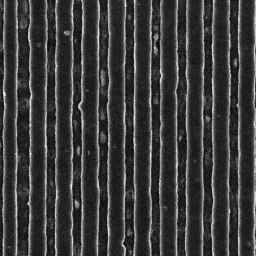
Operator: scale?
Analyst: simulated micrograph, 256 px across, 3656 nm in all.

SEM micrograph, parallel lines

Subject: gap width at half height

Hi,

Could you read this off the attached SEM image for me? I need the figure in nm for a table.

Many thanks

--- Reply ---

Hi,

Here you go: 132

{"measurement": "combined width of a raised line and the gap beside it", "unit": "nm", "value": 376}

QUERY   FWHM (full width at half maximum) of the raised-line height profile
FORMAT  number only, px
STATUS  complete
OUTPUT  16.9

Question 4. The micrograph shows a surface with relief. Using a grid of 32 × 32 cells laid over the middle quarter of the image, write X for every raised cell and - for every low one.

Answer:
XX---XXXX--XXXX---XXXX--XXXX---X
XX---XXXX--XXXX---XXXX--XXXX---X
XX---XXXX--XXXX---XXXX--XXXX---X
XX---XXXXX-XXXX---XXXX--XXXX---X
XX---XXXX---XXX---XXXX--XXXX---X
XX---XXXX--XXXX---XXXX--XXXX---X
XX---XXXX--XXXX---XXXX--XXXX---X
XX---XXXX--XXXX---XXXX--XXXX---X
XX---XXXX--XXXX---XXXX--XXXX---X
XX--XXXXX--XXXX---XXXX--XXXX---X
XX--XXXXX--XXXX---XXXX--XXXX---X
XX--XXXX---XXXX---XXXX--XXXX---X
XX---XXXX--XXXX---XXXX--XXXX---X
XX---XXXX--XXXX---XXXX--XXXX---X
XX---XXXX--XXXX---XXXX--XXXX---X
XX---XXX---XXXX---XXXX--XXXX---X
XX---XXX---XXXX---XXXX--XXXX---X
XX---XXX---XXXX---XXXX--XXXX---X
XX---XXX-X-XXXX---XXXX--XXXX---X
XX---XXX---XXXX---XXXX--XXXX---X
XX---XXX---XXXX---XXXX--XXXX---X
XX---XXXX--XXXX---XXXX--XXXX---X
XX---XXXX--XXXX---XXXX--XXXX---X
XX---XXXX--XXXX---XXXX--XXXX---X
XX---XXXX--XXXX---XXXX--XXXX---X
XX--XXXXX--XXXX---XXXX--XXXX---X
XX--XXXX---XXXX---XXXX--XXXX---X
XX--XXXX---XXXX---XXXX--XXXX---X
XX--XXXX---XXXX---XXXX--XXXX---X
XX--XXXX---XXXX---XXXX--XXXX---X
XX--XXXX---XXXX---XXXX--XXXX---X
XX--XXXXX--XXXX---XXXX--XXXX---X